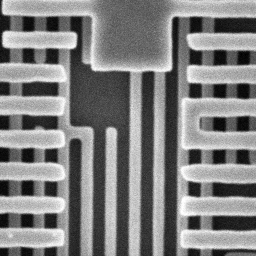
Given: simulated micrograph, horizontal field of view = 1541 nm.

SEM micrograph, wiring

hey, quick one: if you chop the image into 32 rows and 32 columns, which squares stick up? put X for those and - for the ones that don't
XXXXXXXXXXXXXXXXXXXXXXXXXXXXXXXX
XXXXXXXXXXXXXXXXXXXXXXXXXXXXXXXX
------------XXXXXXXXX-----------
------------XXXXXXXXX-----------
XXXXXXXXXX--XXXXXXXXX---XXXXXXXX
XXXXXXXXXX--XXXXXXXXX---XXXXXXXX
-----------XXXXXXXXXX-----------
-----------XXXXXXXXXX-----------
XXXXXXXX----XXXXXXXXX---XXXXXXXX
XXXXXXXX---------------XXXXXXXXX
--------------------------------
--------------------------------
XXXXXXXX---------------XXXXXXXXX
XXXXXXXX---------------XXXXXXXXX
-----------------------XXXXXXXXX
-----------------------XX-------
XXXXXXXX---------------XXX------
XXXXXXXX---------------XXXXXXXXX
-----------------------XXXXX-XXX
--------------------------------
XXXXXXX-------------------------
XXXXXXXX---------------XXXXXXXXX
------X----------------XXXXXXXXX
--------------------------------
--------------------------------
XXXXXXXX---------------XXXXXXXXX
X-XXXXX----------------XXXXXXXXX
--------------------------------
--------------------------------
XXXXXXXX---------------XXXXXXXXX
XXXXXXXX---------------XXXXXXXXX
--------------------------------